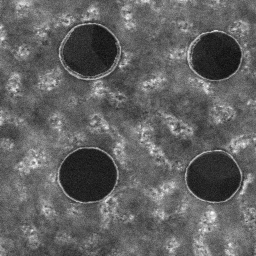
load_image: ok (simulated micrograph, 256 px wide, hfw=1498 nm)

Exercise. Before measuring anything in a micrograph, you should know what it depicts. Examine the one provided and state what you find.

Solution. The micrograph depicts raised bodies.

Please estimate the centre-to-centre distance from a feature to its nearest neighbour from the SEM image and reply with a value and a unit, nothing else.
122 px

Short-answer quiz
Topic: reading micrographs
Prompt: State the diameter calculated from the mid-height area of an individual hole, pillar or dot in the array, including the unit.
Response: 0.326 µm